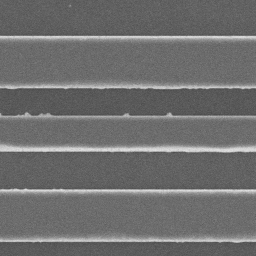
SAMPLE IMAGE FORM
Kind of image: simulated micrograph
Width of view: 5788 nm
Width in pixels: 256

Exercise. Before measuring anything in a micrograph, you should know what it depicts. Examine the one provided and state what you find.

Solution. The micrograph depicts lines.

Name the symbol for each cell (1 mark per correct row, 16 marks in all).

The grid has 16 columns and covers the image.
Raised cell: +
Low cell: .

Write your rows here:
................
................
++++++++++++++++
++++++++++++++++
++++++++++++++++
+.........+++...
................
++++++++++++++++
++++++++++++++++
................
................
................
++++++++++++++++
++++++++++++++++
++++++++++++++++
................